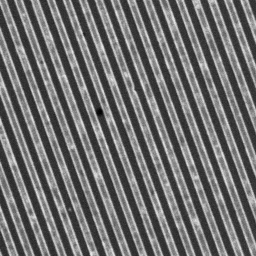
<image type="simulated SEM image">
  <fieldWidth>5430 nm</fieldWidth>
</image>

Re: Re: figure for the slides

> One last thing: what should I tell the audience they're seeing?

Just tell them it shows parallel lines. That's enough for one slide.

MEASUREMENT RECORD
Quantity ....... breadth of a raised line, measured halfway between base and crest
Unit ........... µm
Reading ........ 0.137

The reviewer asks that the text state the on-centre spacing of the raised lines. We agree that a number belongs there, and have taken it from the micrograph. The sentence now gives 0.322 µm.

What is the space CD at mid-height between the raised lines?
182 nm